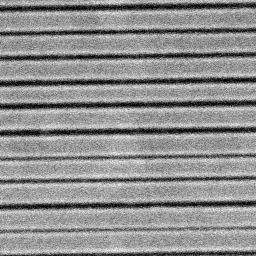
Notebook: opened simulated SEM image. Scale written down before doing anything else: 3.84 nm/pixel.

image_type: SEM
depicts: parallel lines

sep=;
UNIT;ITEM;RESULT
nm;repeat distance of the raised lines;94.6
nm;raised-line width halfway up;70.5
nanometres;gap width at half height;28.3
